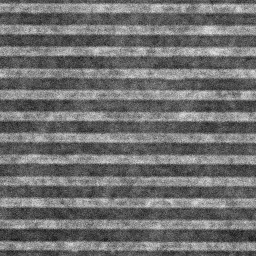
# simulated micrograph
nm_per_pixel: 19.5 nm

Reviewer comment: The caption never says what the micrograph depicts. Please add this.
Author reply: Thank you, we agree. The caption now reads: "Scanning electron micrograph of parallel lines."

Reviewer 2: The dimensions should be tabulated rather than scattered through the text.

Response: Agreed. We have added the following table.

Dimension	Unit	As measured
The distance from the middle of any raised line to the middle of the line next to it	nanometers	422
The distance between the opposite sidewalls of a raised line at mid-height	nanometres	139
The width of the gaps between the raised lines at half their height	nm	278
